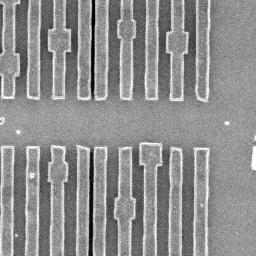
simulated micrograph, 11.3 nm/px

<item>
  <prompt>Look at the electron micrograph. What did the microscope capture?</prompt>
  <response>wiring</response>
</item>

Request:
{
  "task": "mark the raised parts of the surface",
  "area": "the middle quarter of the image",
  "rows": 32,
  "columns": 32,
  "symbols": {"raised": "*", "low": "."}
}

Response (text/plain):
....***.***...***....**....***..
....***.***...***...***....***..
....***.***...***...***....***..
....***.***...***...***....***..
....***.***...***...***....***..
...****.***...***...***....***..
...****.***...***...***....***..
...****.***...***...***....***..
....***.**....***...***....***..
................................
................................
................................
................................
................................
................................
................................
................................
................................
................................
................................
...................*****........
...***..**....***..*****...**...
....**..**....***..*****...**...
...***..**....***..*****...**...
...***..**....***..*****...**...
*..***..**....***...***...***...
*..***..**....***...***...***...
*..***..**....***...***...***...
*..***..**....***...***....**...
...***.***....***...***....**...
...***.***....***...***....**...
...***.***....***...***....**...